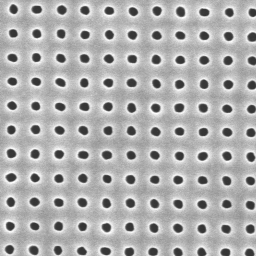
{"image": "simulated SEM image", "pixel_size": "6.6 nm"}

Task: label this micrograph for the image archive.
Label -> a regular array of holes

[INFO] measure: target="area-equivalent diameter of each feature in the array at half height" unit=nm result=59.6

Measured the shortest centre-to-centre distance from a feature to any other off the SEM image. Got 156 nm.